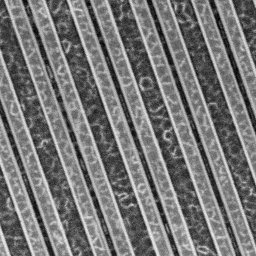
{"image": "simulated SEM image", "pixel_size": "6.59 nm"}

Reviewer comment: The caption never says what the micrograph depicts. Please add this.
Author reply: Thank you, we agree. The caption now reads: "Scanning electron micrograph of parallel lines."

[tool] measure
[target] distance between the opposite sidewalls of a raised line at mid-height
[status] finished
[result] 91.7 nm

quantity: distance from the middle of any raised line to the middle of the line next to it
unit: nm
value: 190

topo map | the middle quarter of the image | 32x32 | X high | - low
X------XXX---XXX------XXXX--XXXX
X------XXXX--XXXX------XXX---XXX
X------XXXX--XXXX------XXXX--XXX
XX------XXXX--XXX------XXXX--XXX
XX------XXXX--XXXX------XXX---XX
XXX------XXX--XXXX------XXXX--XX
XXX------XXXX--XXX------XXXX--XX
XXX------XXXX--XXXX------XXX---X
XXXX------XXX--XXXX------XXXX--X
XXXX------XXXX--XXX------XXXX--X
-XXX------XXXX--XXXX------XXX---
-XXXX------XXX--XXXX------XXXX--
-XXXX------XXXX--XXX------XXXX--
--XXX------XXXX--XXXX------XXXX-
--XXXX------XXX--XXXX------XXXX-
--XXXX------XXXX--XXXX------XXX-
---XXX------XXXX--XXXX------XXXX
X--XXXX------XXX---XXX------XXXX
X--XXXX------XXXX--XXXX------XXX
X---XXX------XXXX--XXXX------XXX
XX--XXXX------XXXX--XXX------XXX
XX--XXXX------XXXX--XXXX------XX
XXX--XXX-------XXX--XXXX------XX
XXX--XXXX------XXXX--XXX------XX
XXX---XXX------XXXX--XXXX------X
XXXX--XXX-------XXX--XXXX------X
XXXX--XXXX------XXXX--XXX------X
-XXX---XXX------XXXX--XXXX------
-XXXX--XXXX------XXX--XXXX------
-XXXX--XXXX------XXXX--XXX------
--XXX---XXX------XXXX--XXXX-----
--XXXX--XXXX------XXX--XXXX-----